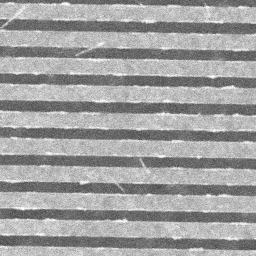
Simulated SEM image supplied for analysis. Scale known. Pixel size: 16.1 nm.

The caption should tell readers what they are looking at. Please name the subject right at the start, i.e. parallel lines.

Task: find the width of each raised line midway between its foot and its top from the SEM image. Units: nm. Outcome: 248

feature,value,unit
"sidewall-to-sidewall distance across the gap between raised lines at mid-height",11.4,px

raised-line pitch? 435 nanometers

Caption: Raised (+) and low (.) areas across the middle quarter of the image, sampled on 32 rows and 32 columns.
++++++++++++++++++++++++++++++++
++++++++++++++++++++++++++++++++
............++++++++++++++++++++
................................
............+...................
+++++++....++...................
++++++++++++++++++++++++++++++++
++++++++++++++++++++++++++++++++
++++++++++++++++++++++++++++++++
..........++....+++..++...++++++
................................
................................
+++++++++++++..........++++.....
++++++++++++++++++++++++++++++++
++++++++++++++++++++++++++++++++
++++++++++++++++++++++++++++++++
................................
................................
................................
+++++++++++++++++++++++++..+++++
++++++++++++++++++++++++++++++++
++++++++++++++++++++++++++++++++
++++++++++++++++++++++++++++++++
................................
................................
................................
++++++++++++++++++++++++++++++++
++++++++++++++++++++++++++++++++
++++++++++++++++++++++++++++++++
....+++..+++++++++++++++++++++++
................................
................................